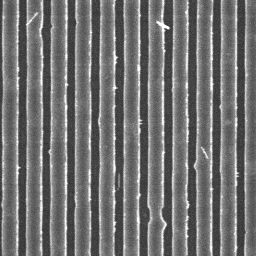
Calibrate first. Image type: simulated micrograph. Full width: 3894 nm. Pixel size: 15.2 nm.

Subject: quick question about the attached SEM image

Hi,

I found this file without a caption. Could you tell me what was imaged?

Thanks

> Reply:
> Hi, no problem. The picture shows parallel lines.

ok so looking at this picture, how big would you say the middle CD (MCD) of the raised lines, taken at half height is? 226 nm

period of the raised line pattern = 0.369 microns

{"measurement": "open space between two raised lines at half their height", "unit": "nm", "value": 135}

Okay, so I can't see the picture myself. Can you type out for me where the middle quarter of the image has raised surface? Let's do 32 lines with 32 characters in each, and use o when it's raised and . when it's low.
o..oooo..oooo..oooo..oooo..oooo.
...ooo...oooo..oooo..oooo..oooo.
...ooo...oooo..oooo..oooo..oooo.
...ooo...oooo..oooo..oooo..oooo.
o..ooo...oooo..oooo..oooo..oooo.
o..ooo...oooo..oooo..oooo..oooo.
...oooo..oooo..oooo..oooo..oooo.
...oooo..oooo..oooo..oooo..oooo.
...oooo..oooo..oooo..oooo..oooo.
...oooo..oooo..oooo..oooo..oooo.
o..oooo..oooo..oooo..oooo..oooo.
o..oooo..oooo..oooo..oooo..oooo.
...oooo..oooo..oooo..oooo..oooo.
...oooo..oooo..oooo..oooo..oooo.
o..oooo..oooo..oooo..oooo..oooo.
o..oooo..oooo..oooo..oooo..oooo.
...oooo..oooo..oooo..oooo..oooo.
...oooo..oooo..oooo..oooo..oooo.
o..ooo...oooo..oooo..oooo..oooo.
o..oooo..oooo..oooo..oooo..oooo.
...oooo..oooo..oooo..oooo..oooo.
...oooo..oooo..oooo..oooo..oooo.
o..oooo..oooo..oooo..oooo..oooo.
o..oooo..oooo..oooo..oooo..oooo.
o..oooo..oooo..oooo..oooo..oooo.
o..oooo..oooo..oooo..oooo..oooo.
o..oooo..oooo..oooo..oooo..oooo.
...oooo..oooo..oooo..oooo..oooo.
o..oooo..oooo..oooo..oooo..oooo.
o..oooo..oooo..oooo..oooo..oooo.
o..ooo...oooo..oooo..oooo..oooo.
o..oooo..oooo..oooo..oooo..oooo.